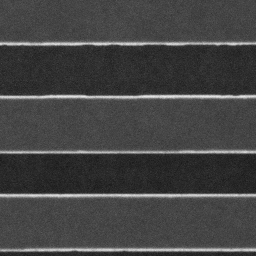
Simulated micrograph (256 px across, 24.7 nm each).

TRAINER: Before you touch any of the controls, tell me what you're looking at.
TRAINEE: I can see lines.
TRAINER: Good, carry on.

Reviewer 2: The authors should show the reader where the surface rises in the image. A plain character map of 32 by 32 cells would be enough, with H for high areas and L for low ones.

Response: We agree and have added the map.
HHHHHHHHHHHHHHHHHHHHHHHHHHHHHHHH
HHHHHHHHHHHHHHHHHHHHHHHHHHHHHHHH
HHHHHHHHHHHHHHHHHHHHHHHHHHHHHHHH
HHHHHHHHHHHHHHHHHHHHHHHHHHHHHHHH
HHHHHHHHHHHHHHHHHHHHHHHHHHHHHHHH
LLLLLHLLLLLLLLLLLLLLLLLLLLLLLLLL
LLLLLLLLLLLLLLLLLLLLLLLLLLLLLLLL
LLLLLLLLLLLLLLLLLLLLLLLLLLLLLLLL
LLLLLLLLLLLLLLLLLLLLLLLLLLLLLLLL
LLLLLLLLLLLLLLLLLLLLLLLLLLLLLLLL
LLLLLLLLLLLLLLLLLLLLLLLLLLLLLLLL
LLLLLLLLLLLLLLLLLLLLLLLLLLLLLLLL
HHHHHHHHHHHHHHHHHHHHHHHHHHHHHHHH
HHHHHHHHHHHHHHHHHHHHHHHHHHHHHHHH
HHHHHHHHHHHHHHHHHHHHHHHHHHHHHHHH
HHHHHHHHHHHHHHHHHHHHHHHHHHHHHHHH
HHHHHHHHHHHHHHHHHHHHHHHHHHHHHHHH
HHHHHHHHHHHHHHHHHHHHHHHHHHHHHHHH
HHHHHHHHHHHHHHHHHHHHHHHHHHHHHHHH
LLLLLLLLLLLLLLLLLLLLLLLLLLLLLLLL
LLLLLLLLLLLLLLLLLLLLLLLLLLLLLLLL
LLLLLLLLLLLLLLLLLLLLLLLLLLLLLLLL
LLLLLLLLLLLLLLLLLLLLLLLLLLLLLLLL
LLLLLLLLLLLLLLLLLLLLLLLLLLLLLLLL
HHHHHHHHHHHHHHHHHHHHHHHHHHHHHHHH
HHHHHHHHHHHHHHHHHHHHHHHHHHHHHHHH
HHHHHHHHHHHHHHHHHHHHHHHHHHHHHHHH
HHHHHHHHHHHHHHHHHHHHHHHHHHHHHHHH
HHHHHHHHHHHHHHHHHHHHHHHHHHHHHHHH
HHHHHHHHHHHHHHHHHHHHHHHHHHHHHHHH
HHHHHHHHHHHHHHHHHHHHHHHHHHHHHHHH
LLLLLLLLLLLLLLLLLLLLLLLLLLLLLLLL